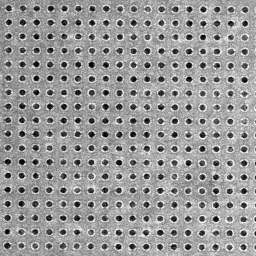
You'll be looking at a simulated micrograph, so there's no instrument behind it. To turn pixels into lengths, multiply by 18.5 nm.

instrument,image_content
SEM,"a regular array of holes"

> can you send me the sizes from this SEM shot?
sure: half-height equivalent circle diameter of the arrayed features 125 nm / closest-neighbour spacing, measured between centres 0.253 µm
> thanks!